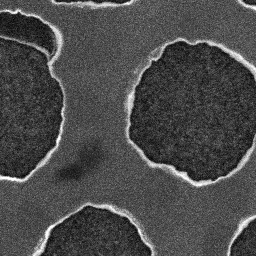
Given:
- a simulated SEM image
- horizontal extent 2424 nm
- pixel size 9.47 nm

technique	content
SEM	holes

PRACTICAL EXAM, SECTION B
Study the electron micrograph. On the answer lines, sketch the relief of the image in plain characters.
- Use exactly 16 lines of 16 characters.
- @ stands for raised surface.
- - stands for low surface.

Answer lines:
@@@@@@@@@@@@@@@@
---@@@@@@@@@@@@@
----@@@@@@@@@@@@
---@@@@@@@-----@
---@@@@@@-------
----@@@@@-------
----@@@@--------
----@@@@--------
----@@@@--------
---@@@@@@-------
--@@@@@@@@@----@
@@@@@@@@@@@@@@@@
@@@@@@@@@@@@@@@@
@@@@----@@@@@@@@
@@@------@@@@@@-
@@@------@@@@@--